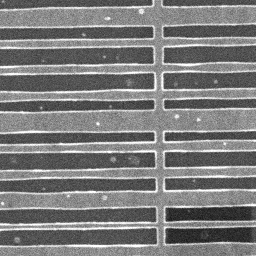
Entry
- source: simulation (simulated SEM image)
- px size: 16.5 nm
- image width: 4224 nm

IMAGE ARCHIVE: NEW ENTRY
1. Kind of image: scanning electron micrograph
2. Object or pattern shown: groups of lines, slits or small figures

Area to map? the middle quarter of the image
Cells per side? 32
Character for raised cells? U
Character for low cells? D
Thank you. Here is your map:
UUUUUUUUUUUUUUUUUUUUUUUUUUUUUUUU
UUUUUUUUUUUUUUUUUUUUUUUUUUUUUUUU
DDDDDDDDDDDDDDDDDDDDDDDUUDDDDDDD
DDDDDDDDDDDDDDDDDDDDDDDUDDDDDDDD
DDDDDDDDDDDDDDDDDDDDDDDUDDDDDDDD
DDDDDDDDDDDDDDDDDDDDDDDUDDDDDDDD
DDDDDDDDDDDDDDDDDDDDDDUUUDDDDDDD
UUUUUUUUUUUUUUUUUUUUUUUUUUUUUUUU
UUUUUUUUUUUUUUUUUUUUUUUUUUUUUUUD
DDDDDDDDDDDDDDDDDDDDDDDUUDDDDDDD
DDDDDDDDDDDDDDDDDDDDDDDUUDDDDDDD
DDDDDDDDDDDDDDDDDDDDDDUUUDDDUDDD
UUUUUUUUUUUUUUUUUUUUUUUUUUUUUUUU
UUUUUUUUUUUUUUUUUUUUUUUUUUUUUUUU
UUUUUUUUUUUUUUUUUUUUUUUUUUUUUUUU
UUUUUUUUUUUUUUUUUUUUUUUUUUUUUUUU
UUUUUUUUUUUUUUUUUUUUUUUUUUUUUUUU
DDDDDDDDDDDDDDDDDDDDDDDUUDDDDDDD
DDDDDDDDDDDDDDDDDDDDDDDUUDDDDDDD
DDDDDDDDDDDDDDDDDDDDDDUUUDDDDUUU
UUUUUUUUUUUUUUUUUUUUUUUUUUUUUUUU
UUUUUUUUUUUUUUUUUUUUUUUUUUUUUUUU
DDDDDDDDDDDDDDDDDDDDDDDUUDDDDDDD
DDDDDDDDDDDDDDDDDDDDDDDUUDDDDDDD
DDDDDDDDDDDDDDDDDDDDDDDUUDDDDDDD
DDDDDDDDDDDDDDDDDDDDDDDUUDDDDDDD
DDDDUUUUUUUUUUUUUUUUUUUUUUUUUUUU
UUUUUUUUUUUUUUUUUUUUUUUUUUUUUUUU
DDDDDDDDDDDDUUUUUDDDDDUUUUDDDDDD
DDDDDDDDDDDDDDDDDDDDDDDUUDDDDDDD
DDDDDDDDDDDDDDDDDDDDDDDUUDDDDDDD
DDDDDDDDDDDDDDDDDDDDDDDUUDDDDDDD